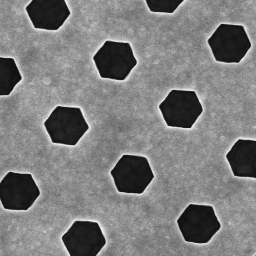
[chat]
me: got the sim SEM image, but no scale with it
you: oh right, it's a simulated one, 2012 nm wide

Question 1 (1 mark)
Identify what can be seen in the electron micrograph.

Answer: holes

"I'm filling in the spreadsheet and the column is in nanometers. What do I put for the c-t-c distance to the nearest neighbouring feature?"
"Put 641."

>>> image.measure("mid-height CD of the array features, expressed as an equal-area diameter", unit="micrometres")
0.313